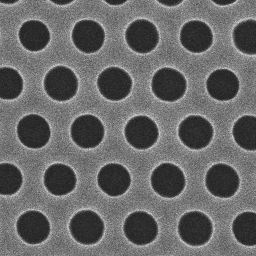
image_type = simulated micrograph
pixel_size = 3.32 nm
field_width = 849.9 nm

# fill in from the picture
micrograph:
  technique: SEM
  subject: a regular array of holes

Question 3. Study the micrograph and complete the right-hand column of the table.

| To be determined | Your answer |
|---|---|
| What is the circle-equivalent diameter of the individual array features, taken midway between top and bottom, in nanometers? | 110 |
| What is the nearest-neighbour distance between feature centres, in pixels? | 54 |